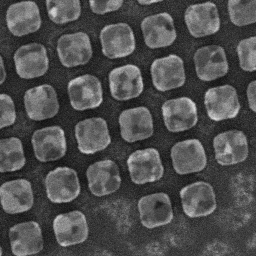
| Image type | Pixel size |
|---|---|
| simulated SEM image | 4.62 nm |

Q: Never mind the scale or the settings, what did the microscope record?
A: a regular array of raised bodies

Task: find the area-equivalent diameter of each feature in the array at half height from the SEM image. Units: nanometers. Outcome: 160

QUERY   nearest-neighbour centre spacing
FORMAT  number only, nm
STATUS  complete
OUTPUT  198